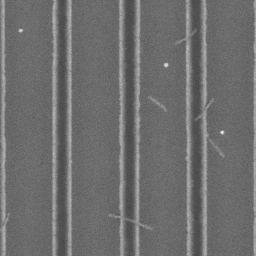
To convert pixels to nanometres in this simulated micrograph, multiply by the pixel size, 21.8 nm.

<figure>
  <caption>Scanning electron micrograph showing lines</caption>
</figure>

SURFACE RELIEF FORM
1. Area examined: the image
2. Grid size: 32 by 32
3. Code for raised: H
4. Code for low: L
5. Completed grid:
LLLLLLLHHLLLLLLHHLLLLLLHHHLLLLLL
LLLLLLLHHLLLLLLHHLLLLLLHHHLLLLLL
LLLLLLLHHLLLLLLHHLLLLLLHHHLLLLLL
LLLLLLLHHLLLLLLHHLLLLLLHHHLLLLLL
LLLLLLLHHLLLLLLHHLLLLLLHHHLLLLLL
LLLLLLLHHLLLLLLHHLLLLLLHHHLLLLLL
LLLLLLLHHLLLLLLHHLLLLLLHHHLLLLLL
LLLLLLLHHLLLLLLHHLLLLLLHHHLLLLLL
LLLLLLLHHLLLLLLHHLLLLLLHHHLLLLLL
LLLLLLLHHLLLLLLHHLLLLLLHHHLLLLLL
LLLLLLLHHLLLLLLHHLLLLLLHHHLLLLLL
LLLLLLLHHLLLLLLHHLLLLLLHHHLLLLLL
LLLLLLLHHLLLLLLHHLLLLLLHHHLLLLLL
LLLLLLLHHLLLLLLHHLLLLLLHHHLLLLLL
LLLLLLLHHLLLLLLHHLLLLLLHHHLLLLLL
LLLLLLLHHLLLLLLHHLLLLLLHHHLLLLLL
LLLLLLLHHLLLLLLHHLLLLLLHHHLLLLLL
LLLLLLLHHLLLLLLHHLLLLLLHHHLLLLLL
LLLLLLLHHLLLLLLHHLLLLLLHHHLLLLLL
LLLLLLLHHLLLLLLHHLLLLLLHHHLLLLLL
LLLLLLLHHLLLLLLHHLLLLLLHHHLLLLLL
LLLLLLLHHLLLLLLHHLLLLLLHHHLLLLLL
LLLLLLLHHLLLLLLHHLLLLLLLHHLLLLLL
LLLLLLLHHLLLLLLHHLLLLLLLHHLLLLLL
LLLLLLLHHLLLLLLHHLLLLLLLHHLLLLLL
LLLLLLLHHLLLLLLHHLLLLLLHHHLLLLLL
LLLLLLLHHLLLLLLHHLLLLLLHHHLLLLLL
HLLLLLLHHLLLLLLHHLLLLLLLHHLLLLLL
HLLLLLLHHLLLLLLHHLLLLLLLHHLLLLLL
LLLLLLLHHLLLLLLHHLLLLLLLHHLLLLLL
LLLLLLLHHLLLLLLHHLLLLLLLHHLLLLLL
HLLLLLLHHLLLLLLHHLLLLLLLHHLLLLLL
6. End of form